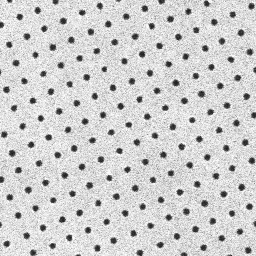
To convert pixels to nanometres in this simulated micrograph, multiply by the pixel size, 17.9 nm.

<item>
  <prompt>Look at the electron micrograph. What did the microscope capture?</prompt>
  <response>a regular array of holes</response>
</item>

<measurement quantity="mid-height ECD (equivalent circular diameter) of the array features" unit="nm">125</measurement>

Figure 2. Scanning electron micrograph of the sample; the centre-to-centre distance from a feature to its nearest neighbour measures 343 nanometers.